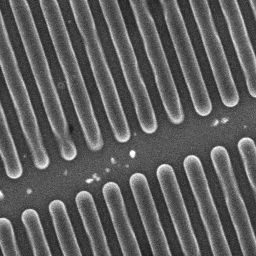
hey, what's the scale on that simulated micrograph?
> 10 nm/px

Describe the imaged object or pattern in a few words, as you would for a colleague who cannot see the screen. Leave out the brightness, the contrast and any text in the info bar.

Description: groups of lines, slits or small figures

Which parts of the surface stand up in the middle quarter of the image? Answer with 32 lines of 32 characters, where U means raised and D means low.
UUUDDDDUUUUDDDUUUUDDDDUUUUDDDUUU
UUUUDDDUUUUDDDDUUUDDDDDUUUDDDDUU
UUUUDDDUUUUUDDDUUUUDDDDUUUUDDDUU
DUUUDDDDUUUUDDDUUUUDDDDUUUUDDDUU
DUUUUDDDUUUUDDDDUUUUDDDUUUUDDDDU
DUUUUDDDDUUUUDDDUUUUDDDUUUUUDDDU
DUUUUUDDDUUUUDDDDUUUUDDDUUUUDDDD
DUUUUUDDDUUUUDDDDUUUUDDDUUUUDDDD
DDUUUUDDDDUUUDDDDUUUUDDDUUUUUDDD
DDUUUUUDDDUUUUDDDDUUUUDDDUUUUDDD
DDDUUUUDDDUUUUDDDDUUUUDDDUUUUDDD
DDDUUUUDDDDUUUDDDDUUUUDDDDUUUDDD
DDDUUUUDDDDUUUUDDDUUUUDDDDUUUUDD
DDDDUUUUDDDUUUUDDDDUUUDDDDDUUUDD
DDDDUUUUDDDDUUUDDDDUUUUDDDDUUDDD
UDDDDUUUDDDDUUUUDDDDUUUDDDDDDDDD
UDDDDUUUUDDDUUUUDDDDUUDDDDDDDDDD
UDDDDUUUUDDDDUUUDDDDDDDDDDDDDDDD
UDDDDDUUUDDDDUUUDDDDDDDDDDDDDDDD
UUDDDDUUUDDDDDDDDDDDDDDDDDDDDDDD
UUDDDDDUUDDDDDDDDDDDDDDDDDDDDDDD
UUUDDDDDDDDDDDDDDDDDDDDDDDDDDDDD
UUUDDDDDDDDDDDDDDDDDDDDDDDDDDDDD
UUDDDDDDDDDDDDDDDDDDDDDDDDDDDDDU
DDDDDDDDDDDDDDDDDDDDDDDDDDDDDDUU
DDDDDDDDDDDDDDDDDDDDDDDDUUDDDDUU
DDDDDDDDDDDDDDDDDDDDDDDUUUUDDDUU
DDDDDDDDDDDDDDDDDDUDDDDUUUUUDDDU
DDDDDDDDDDDDDDDDDUUUDDDUUUUUDDDU
DDDDDDDDDDDDDDDDDUUUUDDDUUUUDDDD
DDDDDDDDDDUUUDDDDUUUUDDDUUUUUDDD
DDDDDDDDDDUUUUDDDUUUUDDDUUUUUDDD